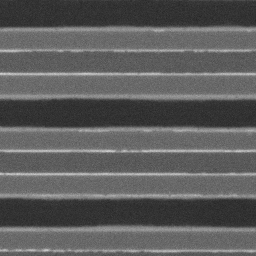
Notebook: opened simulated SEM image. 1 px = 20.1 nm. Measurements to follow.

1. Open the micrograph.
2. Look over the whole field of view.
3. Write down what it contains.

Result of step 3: lines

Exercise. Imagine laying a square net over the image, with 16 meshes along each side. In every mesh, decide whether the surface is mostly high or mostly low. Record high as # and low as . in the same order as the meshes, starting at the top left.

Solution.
................
................
################
################
################
################
................
................
################
################
################
################
................
................
################
################